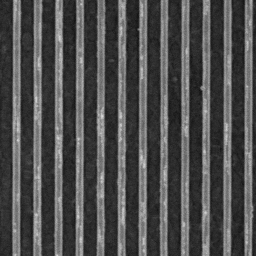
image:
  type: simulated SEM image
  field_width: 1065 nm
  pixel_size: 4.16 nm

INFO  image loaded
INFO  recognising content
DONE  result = parallel lines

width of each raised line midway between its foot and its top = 24.9 nm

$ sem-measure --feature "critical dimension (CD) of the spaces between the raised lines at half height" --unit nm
61.3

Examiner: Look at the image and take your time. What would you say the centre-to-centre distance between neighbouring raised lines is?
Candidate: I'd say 87.6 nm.